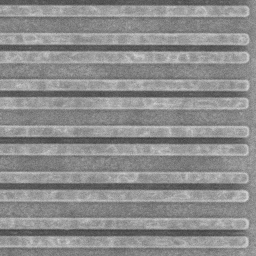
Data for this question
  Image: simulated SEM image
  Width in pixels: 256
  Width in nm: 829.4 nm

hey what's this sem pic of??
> parallel lines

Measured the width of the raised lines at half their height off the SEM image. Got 34.4 nm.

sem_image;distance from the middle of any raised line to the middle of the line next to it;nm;74.7